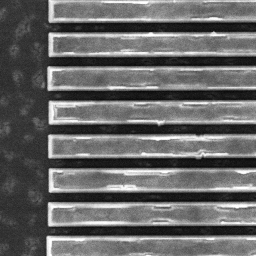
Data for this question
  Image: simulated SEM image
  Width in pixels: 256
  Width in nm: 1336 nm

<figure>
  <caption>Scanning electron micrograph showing parallel lines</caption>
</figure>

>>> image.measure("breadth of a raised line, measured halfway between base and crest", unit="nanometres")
114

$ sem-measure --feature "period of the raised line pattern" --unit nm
177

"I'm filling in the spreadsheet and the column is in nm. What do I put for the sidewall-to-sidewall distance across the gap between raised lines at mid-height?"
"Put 62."